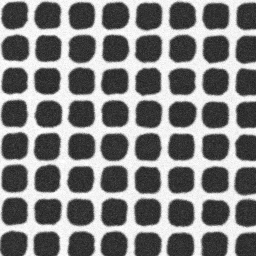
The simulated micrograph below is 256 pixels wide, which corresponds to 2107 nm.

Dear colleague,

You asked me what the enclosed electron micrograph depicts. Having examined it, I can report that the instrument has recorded a regular array of holes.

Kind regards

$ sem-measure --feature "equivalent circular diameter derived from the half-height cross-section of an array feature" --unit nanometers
236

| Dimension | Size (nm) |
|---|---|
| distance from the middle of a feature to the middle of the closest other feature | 268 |